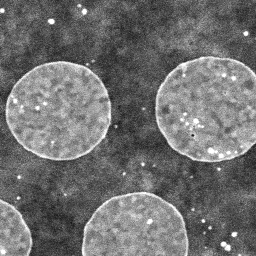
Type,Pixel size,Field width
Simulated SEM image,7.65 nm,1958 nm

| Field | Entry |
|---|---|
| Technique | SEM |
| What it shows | raised bodies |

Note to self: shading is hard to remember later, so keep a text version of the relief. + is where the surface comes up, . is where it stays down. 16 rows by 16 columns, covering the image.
................
................
................
................
..++++.....+++++
.++++++...++++++
+++++++...++++++
+++++++...++++++
.+++++....++++++
..+++......++++.
................
................
.......+++......
+.....+++++.....
++...+++++++....
++...+++++++....